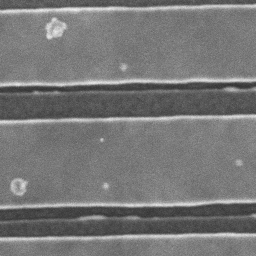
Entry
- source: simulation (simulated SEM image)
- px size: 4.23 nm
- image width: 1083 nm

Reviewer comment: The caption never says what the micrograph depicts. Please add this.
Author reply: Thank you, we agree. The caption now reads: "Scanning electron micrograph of lines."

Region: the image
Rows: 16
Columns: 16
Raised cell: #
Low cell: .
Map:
.......#.#######
################
################
################
################
................
................
..##############
################
################
################
################
################
................
................
################